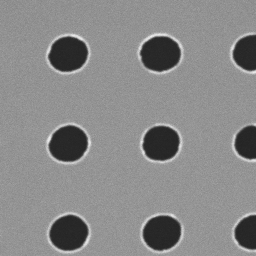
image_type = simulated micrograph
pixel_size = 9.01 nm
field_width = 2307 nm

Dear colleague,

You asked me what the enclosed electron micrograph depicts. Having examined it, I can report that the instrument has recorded holes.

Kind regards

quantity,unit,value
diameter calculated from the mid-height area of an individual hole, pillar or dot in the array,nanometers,342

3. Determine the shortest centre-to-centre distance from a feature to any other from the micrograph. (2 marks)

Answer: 806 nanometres